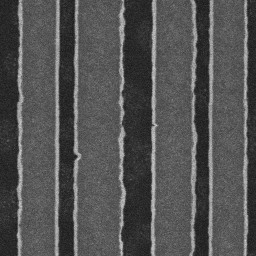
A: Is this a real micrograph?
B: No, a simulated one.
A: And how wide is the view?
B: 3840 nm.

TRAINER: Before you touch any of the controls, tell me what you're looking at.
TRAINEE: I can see one or a few lines or trenches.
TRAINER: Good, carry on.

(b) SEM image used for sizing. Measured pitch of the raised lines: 63.2 pixels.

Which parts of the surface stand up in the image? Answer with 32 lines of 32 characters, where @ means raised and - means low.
---@@@@---@@@@@----@@@@@--@@@@@-
---@@@@---@@@@@----@@@@@--@@@@@-
---@@@@---@@@@@----@@@@@--@@@@@-
---@@@@---@@@@@----@@@@@--@@@@@-
---@@@@---@@@@@----@@@@@--@@@@@-
---@@@@---@@@@@----@@@@@--@@@@@-
---@@@@---@@@@@----@@@@@--@@@@@-
---@@@@---@@@@@----@@@@@--@@@@@-
---@@@@---@@@@@----@@@@@--@@@@@-
--@@@@@---@@@@@----@@@@@--@@@@@-
--@@@@@--@@@@@@----@@@@@--@@@@@-
--@@@@@--@@@@@@----@@@@@--@@@@@-
---@@@@--@@@@@@----@@@@@--@@@@@-
--@@@@@--@@@@@@----@@@@@--@@@@@-
--@@@@@--@@@@@@----@@@@@--@@@@@-
--@@@@@--@@@@@@----@@@@@--@@@@@-
---@@@@--@@@@@@----@@@@@--@@@@@-
--@@@@@--@@@@@@----@@@@@--@@@@@-
--@@@@@--@@@@@@----@@@@@--@@@@@-
--@@@@@---@@@@@----@@@@@--@@@@@-
--@@@@@--@@@@@@----@@@@@--@@@@@-
---@@@@--@@@@@@----@@@@@--@@@@@-
---@@@@--@@@@@@----@@@@@--@@@@@-
--@@@@@--@@@@@@----@@@@@--@@@@@-
--@@@@@--@@@@@@----@@@@@--@@@@@-
---@@@@--@@@@@@----@@@@@--@@@@@-
--@@@@@--@@@@@@----@@@@@--@@@@@-
--@@@@@--@@@@@@----@@@@@--@@@@@-
--@@@@@--@@@@@@----@@@@@--@@@@@-
--@@@@@--@@@@@@----@@@@@--@@@@@-
--@@@@@--@@@@@@----@@@@@--@@@@@-
--@@@@@---@@@@@----@@@@@--@@@@@-